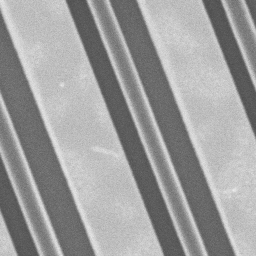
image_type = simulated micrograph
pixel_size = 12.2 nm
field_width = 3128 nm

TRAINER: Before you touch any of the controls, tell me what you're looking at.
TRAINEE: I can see lines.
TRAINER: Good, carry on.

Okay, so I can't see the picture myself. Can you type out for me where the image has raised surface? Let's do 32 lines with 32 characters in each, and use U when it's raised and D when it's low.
UUUUUUUUDDDUUUDDDUUUUUUUUDDDUUUD
UUUUUUUUUDDUUUDDDDUUUUUUUUDDUUUD
DUUUUUUUUDDDUUUDDDUUUUUUUUDDDUUU
DUUUUUUUUDDDUUUDDDDUUUUUUUUDDUUU
DDUUUUUUUUDDDUUDDDDUUUUUUUUDDUUU
DDUUUUUUUUDDDUUUDDDDUUUUUUUDDDUU
DDUUUUUUUUUDDUUUDDDDUUUUUUUUDDUU
DDDUUUUUUUUDDDUUUDDDUUUUUUUUDDDU
DDDUUUUUUUUDDDUUUDDDDUUUUUUUUDDU
DDDUUUUUUUUUDDDUUDDDDUUUUUUUUDDU
DDDDUUUUUUUUDDDUUUDDDUUUUUUUUDDD
DDDDUUUUUUUUUDDUUUDDDDUUUUUUUUDD
DDDDDUUUUUUUUDDDUUDDDDUUUUUUUUDD
UDDDDUUUUUUUUDDDUUUDDDUUUUUUUUDD
UDDDDUUUUUUUUUDDUUUDDDDUUUUUUUUD
UDDDDDUUUUUUUUDDDUUUDDDUUUUUUUUD
UUDDDDUUUUUUUUUDDUUUDDDDUUUUUUUU
UUDDDDUUUUUUUUUDDDUUDDDDUUUUUUUU
UUUDDDDUUUUUUUUDDDUUUDDDUUUUUUUU
UUUDDDDUUUUUUUUUDDUUUDDDDUUUUUUU
DUUDDDDDUUUUUUUUDDDUUUDDDUUUUUUU
DUUUDDDDUUUUUUUUDDDUUUDDDDUUUUUU
DUUUDDDDUUUUUUUUUDDDUUDDDDUUUUUU
DDUUUDDDDUUUUUUUUDDDUUUDDDUUUUUU
DDUUUDDDDUUUUUUUUUDDUUUDDDDUUUUU
DDUUUDDDDDUUUUUUUUDDDUUDDDDUUUUU
DDDUUUDDDDUUUUUUUUDDDUUUDDDUUUUU
DDDUUUDDDDUUUUUUUUUDDDUUDDDDUUUU
UDDDUUDDDDDUUUUUUUUDDDUUUDDDUUUU
UDDDUUUDDDDUUUUUUUUUDDUUUDDDDUUU
UUDDUUUDDDDDUUUUUUUUDDDUUDDDDUUU
UUDDDUUUDDDDUUUUUUUUDDDUUUDDDUUU